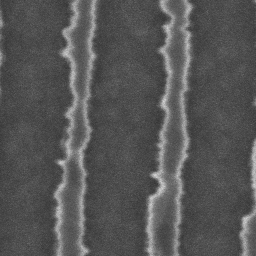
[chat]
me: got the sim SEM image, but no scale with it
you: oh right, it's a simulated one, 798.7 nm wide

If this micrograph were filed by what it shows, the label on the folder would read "one or a few lines or trenches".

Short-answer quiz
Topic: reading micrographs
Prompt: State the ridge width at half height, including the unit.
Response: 65.6 nm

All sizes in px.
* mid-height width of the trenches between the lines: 73.8